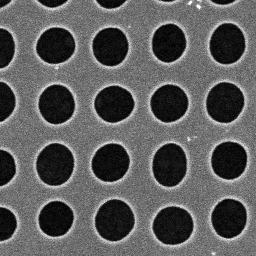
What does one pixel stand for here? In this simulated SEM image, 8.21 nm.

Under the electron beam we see a regular array of holes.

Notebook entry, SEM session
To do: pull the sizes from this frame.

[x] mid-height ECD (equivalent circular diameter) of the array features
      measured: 0.314 microns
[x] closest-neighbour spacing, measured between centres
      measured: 0.462 um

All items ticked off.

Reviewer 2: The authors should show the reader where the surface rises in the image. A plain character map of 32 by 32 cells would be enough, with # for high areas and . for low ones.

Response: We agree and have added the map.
.####...####...############..###
################################
################################
#######.#####.######..#####...##
..###....###....###....###....##
..###....###....###....###.....#
..###....###....###....###....##
.####...####...#####..#####...##
################################
################################
.##########################..###
..###....###....###....###....##
..###....###.....##....###.....#
..###....###.....##....###....##
.####....###....###....###....##
################################
################################
################################
#####...####...#####...####...##
.####....###....###....###.....#
..###....##.....###....###.....#
..###....###....###....####...##
.####...#####..#####...#########
################################
################################
######..#####...###########...##
.####....###.....###....###....#
..###....###.....##.....##.....#
..###....###.....##.....###....#
.#####.######...###.....####..##
#####################.##########
################################